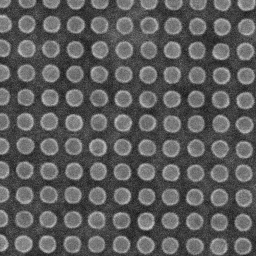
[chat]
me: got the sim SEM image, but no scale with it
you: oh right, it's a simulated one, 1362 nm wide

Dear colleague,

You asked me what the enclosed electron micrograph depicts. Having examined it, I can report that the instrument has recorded a regular array of raised bodies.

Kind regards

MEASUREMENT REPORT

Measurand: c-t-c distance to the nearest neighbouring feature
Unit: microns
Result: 0.127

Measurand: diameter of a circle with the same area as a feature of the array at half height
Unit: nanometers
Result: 86.4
